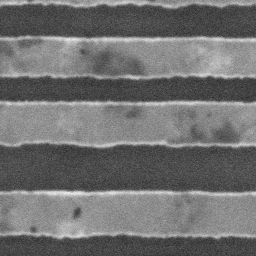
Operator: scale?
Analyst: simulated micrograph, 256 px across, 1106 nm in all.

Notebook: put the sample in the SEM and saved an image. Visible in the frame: lines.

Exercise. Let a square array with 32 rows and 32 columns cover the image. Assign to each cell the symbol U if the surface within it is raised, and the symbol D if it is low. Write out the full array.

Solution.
UDDDDDDDUUUUDUUDDUDUUUUUDDUUUDUD
DDDDDDDDDDDDDDDDDDDDDDDDDDDDDDDD
DDDDDDDDDDDDDDDDDDDDDDDDDDDDDDDD
DDDDDDDDDDDDDDDDDDDDDDDDDDDDDDDD
DDDDDDDDDDDDDDDDDDDDDDDDDDDDDDDD
UUUUUUUUUUUUUUUUUUUUUUUUUUUUUUUU
UUUUUUUUUUUUUUUUUUUUUUUUUUUUUUUU
UUUUUUUUUUUUUUUUUUUUUUUUUUUUUUUU
UUUUUUUUUUUUUUUUUUUUUUUUUUUUUUUU
UUUDUDUUUUDUUUUUUUUUUUDUDUDUUUUU
DDDDDDDDDDDDDDDDDDDDDDDDDDDDDDDD
DDDDDDDDDDDDDDDDDDDDDDDDDDDDDDDD
DDDDDDDDDDDDDDDDDDDDDDDDDDDDDDDD
UUUUUUUUUUUUUUUUUUUUUUUUUUUUUUUU
UUUUUUUUUUUUUUUUUUUUUUUUUUUUUUUU
UUUUUUUUUUUUUUUUUUUUUUUUUUUUUUUU
UUUUUUUUUUUUUUUUUUUUUUUUUUUUUUUU
UUUUUUUUUUUUUUUUUUUUUUUUUUUUUUUU
DDDDDDDDDDDDDDDDDDDDDDDDDDDDDDDD
DDDDDDDDDDDDDDDDDDDDDDDDDDDDDDDD
DDDDDDDDDDDDDDDDDDDDDDDDDDDDDDDD
DDDDDDDDDDDDDDDDDDDDDDDDDDDDDDDD
DDDDDDDDDDDDDDDDDDDDDDDDDDDDDDDD
DDDDDDDDDDDDDDDDDDDDDDDDDDDDDDDD
UUUUUUUUUUUUUUUUUUUUUUUUUUUUUUUU
UUUUUUUUUUUUUUUUUUUUUUUUUUUUUUUU
UUUUUUUUUUUUUUUUUUUUUUUUUUUUUUUU
UUUUUUUUUUUUUUUUUUUUUUUUUUUUUUUU
UUUUUUUUUUUUUUUUUUUUUUUUUUUUUUUU
DDDDDDUUUUUDDDDDDDUUUUDUUUUUUUUU
DDDDDDDDDDDDDDDDDDDDDDDDDDDDDDDD
DDDDDDDDDDDDDDDDDDDDDDDDDDDDDDDD